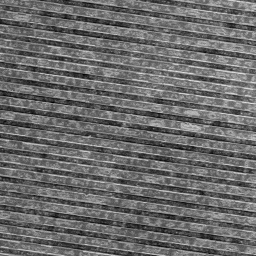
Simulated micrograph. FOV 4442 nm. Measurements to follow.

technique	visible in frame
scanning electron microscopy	parallel lines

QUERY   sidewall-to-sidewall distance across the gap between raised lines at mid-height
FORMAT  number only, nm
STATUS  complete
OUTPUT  105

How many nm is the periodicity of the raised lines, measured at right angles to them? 245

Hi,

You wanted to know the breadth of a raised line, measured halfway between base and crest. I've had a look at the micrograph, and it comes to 152 nanometers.